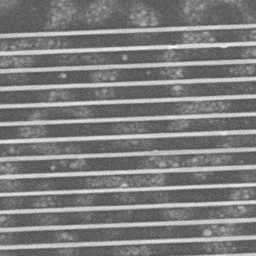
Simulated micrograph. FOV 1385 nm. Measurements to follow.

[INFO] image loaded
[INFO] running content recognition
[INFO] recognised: parallel lines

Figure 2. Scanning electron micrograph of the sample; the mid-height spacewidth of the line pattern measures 78.3 nanometers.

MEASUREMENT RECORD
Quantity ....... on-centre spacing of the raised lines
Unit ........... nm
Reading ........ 95.3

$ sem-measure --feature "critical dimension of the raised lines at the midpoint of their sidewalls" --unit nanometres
18.2